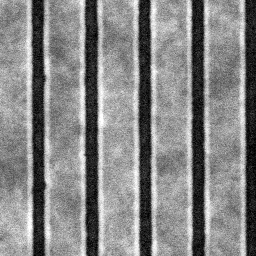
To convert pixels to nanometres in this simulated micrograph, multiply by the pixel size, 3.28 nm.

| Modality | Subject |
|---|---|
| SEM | parallel lines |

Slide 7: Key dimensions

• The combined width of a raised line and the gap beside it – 0.175 micrometres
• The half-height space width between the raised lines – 52.4 nanometers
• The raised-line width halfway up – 123 nanometers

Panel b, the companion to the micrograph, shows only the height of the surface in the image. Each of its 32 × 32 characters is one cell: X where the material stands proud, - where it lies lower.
XXXX--XXXX--XXXXX--XXXXX--XXXX--
XXXX--XXXX--XXXXX--XXXXX--XXXX--
XXXX--XXXX--XXXXX--XXXXX--XXXX--
XXXX--XXXX---XXXX--XXXXX--XXXX--
XXXX--XXXX---XXXX--XXXXX--XXXX--
XXXX--XXXX---XXXX--XXXXX--XXXX--
XXXX--XXXX---XXXX--XXXXX--XXXX--
XXXX--XXXX--XXXXX--XXXXX--XXXX--
XXXX--XXXX---XXXX--XXXXX--XXXX--
XXXX--XXXX--XXXXX--XXXXX--XXXX--
XXXX--XXXX--XXXXX--XXXXX--XXXX--
XXXX--XXXX--XXXXX--XXXXX--XXXX--
XXXX--XXXX---XXXX--XXXXX--XXXX--
XXXX--XXXX--XXXXX--XXXXX--XXXX--
XXXX--XXXX--XXXXX--XXXXX--XXXX--
XXXX--XXXX---XXXX--XXXXX--XXXX--
XXXX--XXXX---XXXX--XXXXX--XXXX--
XXXX--XXXX--XXXXX--XXXXX--XXXX--
XXXX--XXXX--XXXXX--XXXXX--XXXX--
XXXX--XXXX--XXXXX--XXXXX--XXXX--
XXXX--XXXX--XXXXX--XXXXX--XXXX--
XXXX--XXXX---XXXX--XXXXX--XXXX--
XXXX--XXXX---XXXX--XXXXX--XXXX--
XXXX--XXXX---XXXX--XXXXX--XXXX--
XXXX--XXXX---XXXX--XXXXX--XXXX--
XXXX--XXXX---XXXX--XXXXX--XXXX--
XXXX--XXXX---XXXX--XXXXX--XXXX--
XXXX--XXXX---XXXX--XXXXX--XXXX--
XXXX--XXXX---XXXX--XXXXX--XXXX--
XXXX--XXXX---XXXX--XXXXX--XXXX--
XXXX--XXXX---XXXX--XXXXX--XXXX--
XXXX--XXXX---XXXX--XXXXX--XXXX--